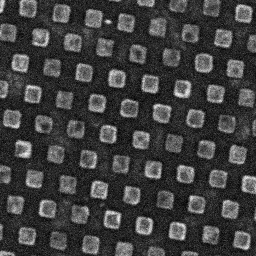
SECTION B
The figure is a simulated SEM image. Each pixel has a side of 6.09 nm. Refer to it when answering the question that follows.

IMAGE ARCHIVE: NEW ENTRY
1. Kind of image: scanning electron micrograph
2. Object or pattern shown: a regular array of raised bodies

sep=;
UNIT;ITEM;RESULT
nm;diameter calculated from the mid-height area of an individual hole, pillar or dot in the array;107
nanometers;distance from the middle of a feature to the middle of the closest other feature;193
